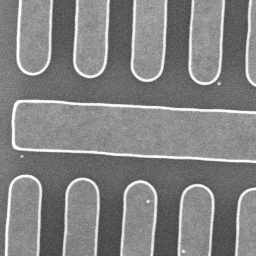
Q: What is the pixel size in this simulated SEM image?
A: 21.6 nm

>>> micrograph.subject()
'groups of lines, slits or small figures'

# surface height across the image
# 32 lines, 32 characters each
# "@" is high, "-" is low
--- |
---@@@----@@@@---@@@@---@@@@---@
--@@@@----@@@----@@@@---@@@@---@
--@@@@----@@@----@@@@---@@@@---@
--@@@@---@@@@----@@@@---@@@@---@
--@@@@---@@@@----@@@@---@@@@---@
--@@@@---@@@@----@@@@---@@@@---@
--@@@@---@@@@----@@@@---@@@@---@
--@@@@---@@@@----@@@----@@@@---@
---@@@---@@@@----@@@----@@@----@
-----------@-----@@@----@@@----@
--------------------------------
--------------------------------
--------------------------------
--@@@@@@@@@@@@@@@@@@@-----------
--@@@@@@@@@@@@@@@@@@@@@@@@@@@@@@
--@@@@@@@@@@@@@@@@@@@@@@@@@@@@@@
--@@@@@@@@@@@@@@@@@@@@@@@@@@@@@@
--@@@@@@@@@@@@@@@@@@@@@@@@@@@@@@
--@@@@@@@@@@@@@@@@@@@@@@@@@@@@@@
-----------------@@@@@@@@@@@@@@@
--------------------------------
--------------------------------
--@@@-----@---------------------
-@@@@----@@@----@@@-----@@------
-@@@@---@@@@----@@@@---@@@----@@
-@@@@---@@@@----@@@@---@@@@---@@
-@@@@---@@@@----@@@----@@@@---@@
-@@@@---@@@@---@@@@----@@@@---@@
-@@@@---@@@@---@@@@----@@@----@@
-@@@@---@@@@---@@@@---@@@@----@@
-@@@@---@@@@---@@@@---@@@@----@@
-@@@@---@@@@---@@@@---@@@@---@@@